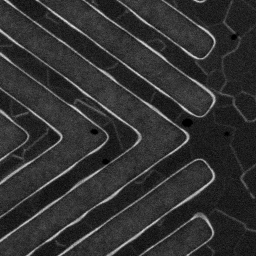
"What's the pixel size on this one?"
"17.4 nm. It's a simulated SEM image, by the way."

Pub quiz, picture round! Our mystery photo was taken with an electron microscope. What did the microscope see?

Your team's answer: groups of lines, slits or small figures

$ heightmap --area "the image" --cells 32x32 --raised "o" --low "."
.oooo......oooo......ooooooooooo
...oooo.....ooooo.....oooooooooo
....oooo......oooo......oooooooo
.....oooo......oooo......ooooooo
o......oooo......oooo.....oooooo
oo......oooo......oooo.....ooooo
oooo.....ooooo.....oooo...oooooo
.oooo......oooo......ooooooooooo
..oooo......oooo......oooooooooo
....oooo......oooo.....ooooooooo
.....oooo......oooo......ooooooo
o.....oooo......oooo......oooooo
oo......oooo......oooo.....ooooo
ooo......oooo......oooo...oooooo
.oooo......oooo.....oooooooooooo
..oooo......oooo......oooooooooo
...oooo......oooo......ooooooooo
...oooo......oooo......ooooooooo
..oooo......oooo......oooooooooo
.oooo......oooo......ooooooooooo
ooo......ooooo.....ooooo..oooooo
oo......oooo......oooo.....ooooo
o......oooo.....ooooo......ooooo
.....oooo......oooo......ooooooo
....oooo......oooo......oooooooo
..oooo......ooooo......ooooooooo
.oooo......oooo......ooooooooooo
oooo......oooo......oooo..oooooo
oo......oooo......oooo....oooooo
o......oooo......oooo.....oooooo
.....oooo.......oooo.....ooooooo
....oooo......oooo......oooooooo